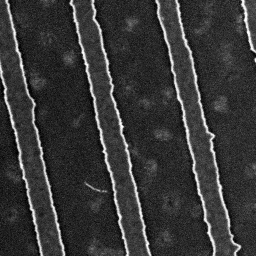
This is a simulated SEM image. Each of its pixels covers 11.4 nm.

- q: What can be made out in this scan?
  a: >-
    one or a few lines or trenches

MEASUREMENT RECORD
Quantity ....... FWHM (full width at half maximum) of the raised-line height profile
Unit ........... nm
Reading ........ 248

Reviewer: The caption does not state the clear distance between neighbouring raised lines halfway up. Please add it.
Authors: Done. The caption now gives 0.711 um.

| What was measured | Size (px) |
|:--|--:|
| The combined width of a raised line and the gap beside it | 83.7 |